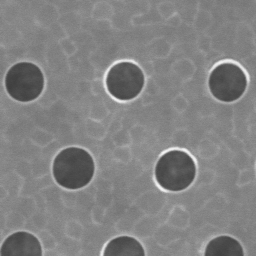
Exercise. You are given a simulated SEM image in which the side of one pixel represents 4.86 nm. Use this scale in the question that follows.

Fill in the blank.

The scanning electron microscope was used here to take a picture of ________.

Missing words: holes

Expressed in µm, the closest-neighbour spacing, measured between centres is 0.488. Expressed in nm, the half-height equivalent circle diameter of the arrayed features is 195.